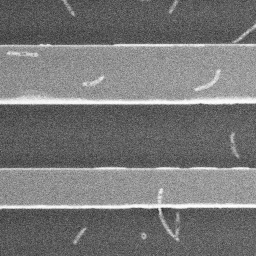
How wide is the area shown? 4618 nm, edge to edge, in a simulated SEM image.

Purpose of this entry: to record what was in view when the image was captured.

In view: lines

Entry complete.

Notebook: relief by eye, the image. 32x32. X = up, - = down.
--------------------------------
--------------------------------
--------------------------------
--------------------------------
--------------------------------
--------------------------------
XXXXXXXXXXXXXXXXXXXXXXXXXXXXXXXX
XXXXXXXXXXXXXXXXXXXXXXXXXXXXXXXX
XXXXXXXXXXXXXXXXXXXXXXXXXXXXXXXX
XXXXXXXXXXXXXXXXXXXXXXXXXXXXXXXX
XXXXXXXXXXXXXXXXXXXXXXXXXXXXXXXX
XXXXXXXXXXXXXXXXXXXXXXXXXXXXXXXX
XXXXXXXXXXXXXXXXXXXXXXXXXXXXXXXX
--------------------------------
--------------------------------
--------------------------------
--------------------------------
--------------------------------
--------------------------------
--------------------------------
--------------------------------
XXXXXXXXXXXXXXXXXXXXXXXXXXXXXXXX
XXXXXXXXXXXXXXXXXXXXXXXXXXXXXXXX
XXXXXXXXXXXXXXXXXXXXXXXXXXXXXXXX
XXXXXXXXXXXXXXXXXXXXXXXXXXXXXXXX
XXXXXXXXXXXXXXXXXXXXXXXXXXXXXXXX
--------------------------------
--------------------------------
--------------------------------
--------------------------------
--------------------------------
--------------------------------